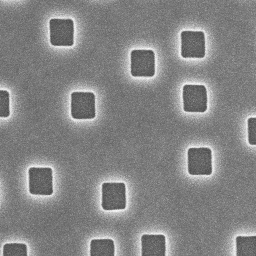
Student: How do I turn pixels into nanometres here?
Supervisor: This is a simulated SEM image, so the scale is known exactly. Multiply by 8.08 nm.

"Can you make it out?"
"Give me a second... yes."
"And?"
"a regular array of holes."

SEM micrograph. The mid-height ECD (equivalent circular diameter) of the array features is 233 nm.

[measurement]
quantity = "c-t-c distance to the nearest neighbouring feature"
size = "550 nm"